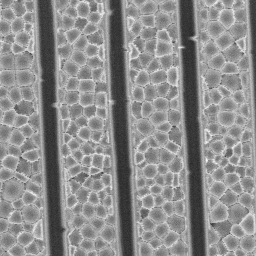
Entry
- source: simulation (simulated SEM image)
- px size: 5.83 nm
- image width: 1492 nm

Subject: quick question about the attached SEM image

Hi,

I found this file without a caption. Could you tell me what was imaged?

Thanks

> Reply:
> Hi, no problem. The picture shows one or a few lines or trenches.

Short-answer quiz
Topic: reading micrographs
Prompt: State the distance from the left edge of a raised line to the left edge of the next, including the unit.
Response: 0.412 um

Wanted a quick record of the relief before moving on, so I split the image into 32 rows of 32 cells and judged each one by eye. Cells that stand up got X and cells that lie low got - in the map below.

XXXX---XXXXXX--XXXXXXX--XXXXXXX-
XXXXX--XXXXXXX-XXXXXXX--XXXXXXX-
XXXXX--XXXXXX--XXXXXXX--XXXXXXX-
XXXXX--XXXXXX---XXXXXX--XXXXXXX-
XXXXX--XXXXXXX--XXXXXX--XXXXXXX-
XXXXX--XXXXXXX--XXXXXX---XXXXXX-
XXXXX--XXXXXXX--XXXXXXX--XXXXXX-
XXXXX--XXXXXXX--XXXXXXX--XXXXXX-
XXXXX--XXXXXXX--XXXXXXX--XXXXXX-
XXXXX--XXXXXXX--XXXXXXX--XXXXXX-
XXXXX--XXXXXXX--XXXXXXX--XXXXXX-
XXXXX--XXXXXXX--XXXXXXX--XXXXXXX
XXXXX--XXXXXXX--XXXXXXX--XXXXXXX
XXXXX--XXXXXXX--XXXXXXX--XXXXXXX
XXXXX--XXXXXXX--XXXXXXX--XXXXXXX
XXXXX--XXXXXXX--XXXXXXX--XXXXXXX
XXXXX--XXXXXXX--XXXXXXX--XXXXXXX
XXXXX--XXXXXXX--XXXXXXX--XXXXXXX
XXXXX--XXXXXXX--XXXXXXX--XXXXXXX
XXXXX---XXXXXX--XXXXXXX--XXXXXXX
XXXXX---XXXXXX--XXXXXXX--XXXXXXX
XXXXXX--XXXXXX--XXXXXXX--XXXXXXX
XXXXXX--XXXXXXX-XXXXXXX--XXXXXXX
XXXXXX--XXXXXXX--XXXXXX--XXXXXXX
XXXXXX--XXXXXXX--XXXXXX---XXXXXX
XXXXXX--XXXXXXX--XXXXXXX--XXXXXX
XXXXXX--XXXXXXX--XXXXXXX--XXXXXX
XXXXXX--XXXXXXX--XXXXXXX--XXXXXX
XXXXXX--XXXXXXX--XXXXXXX--XXXXXX
XXXXXX--XXXXXXX--XXXXXXX--XXXXXX
XXXXXX--XXXXXXX--XXXXXXX--XXXXXX
XXXXXX--XXXXXXX--XXXXXXX--XXXXXX